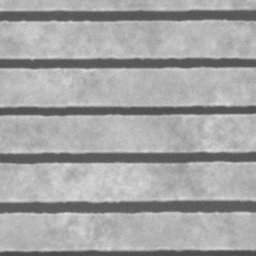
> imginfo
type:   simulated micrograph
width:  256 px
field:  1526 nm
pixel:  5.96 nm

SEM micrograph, lines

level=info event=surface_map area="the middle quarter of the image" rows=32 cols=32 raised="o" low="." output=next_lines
................................
oooooooooooooooooooooooooooooooo
oooooooooooooooooooooooooooooooo
oooooooooooooooooooooooooooooooo
oooooooooooooooooooooooooooooooo
oooooooooooooooooooooooooooooooo
oooooooooooooooooooooooooooooooo
oooooooooooooooooooooooooooooooo
oooooooooooooooooooooooooooooooo
oooooooooooooooooooooooooooooooo
oooooo.o..ooooooooooooooooooooo.
................................
................................
oooooooooooooooooooooooooooooooo
oooooooooooooooooooooooooooooooo
oooooooooooooooooooooooooooooooo
oooooooooooooooooooooooooooooooo
oooooooooooooooooooooooooooooooo
oooooooooooooooooooooooooooooooo
oooooooooooooooooooooooooooooooo
oooooooooooooooooooooooooooooooo
oooooooooooooooooooooooooooooooo
................................
................................
................................
oooooooooooooooooooooooooooooooo
oooooooooooooooooooooooooooooooo
oooooooooooooooooooooooooooooooo
oooooooooooooooooooooooooooooooo
oooooooooooooooooooooooooooooooo
oooooooooooooooooooooooooooooooo
oooooooooooooooooooooooooooooooo